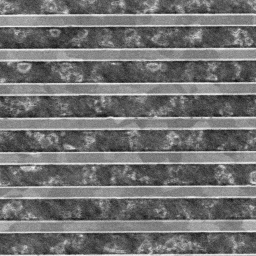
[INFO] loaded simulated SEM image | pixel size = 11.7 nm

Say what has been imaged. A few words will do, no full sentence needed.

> parallel lines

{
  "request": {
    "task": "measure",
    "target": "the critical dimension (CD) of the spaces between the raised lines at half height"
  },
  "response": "277 nm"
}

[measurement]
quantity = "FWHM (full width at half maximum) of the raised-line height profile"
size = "0.128 micrometres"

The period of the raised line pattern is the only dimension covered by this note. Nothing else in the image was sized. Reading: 403 nanometres